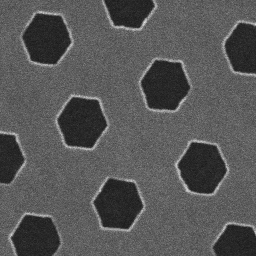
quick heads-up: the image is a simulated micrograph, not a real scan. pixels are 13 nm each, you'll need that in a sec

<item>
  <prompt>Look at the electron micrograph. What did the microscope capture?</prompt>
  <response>holes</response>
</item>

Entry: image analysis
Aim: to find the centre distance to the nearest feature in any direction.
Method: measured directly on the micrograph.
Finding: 1180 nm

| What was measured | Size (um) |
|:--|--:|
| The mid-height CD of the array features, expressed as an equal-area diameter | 0.637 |